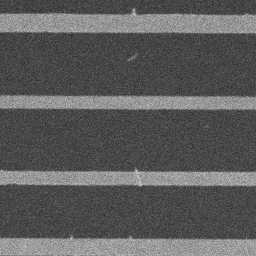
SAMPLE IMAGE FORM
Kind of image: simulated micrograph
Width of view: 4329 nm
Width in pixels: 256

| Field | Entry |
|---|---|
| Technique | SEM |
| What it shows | one or a few lines or trenches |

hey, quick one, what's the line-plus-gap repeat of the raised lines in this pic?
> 76.7 pixels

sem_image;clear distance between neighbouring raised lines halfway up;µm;1.07